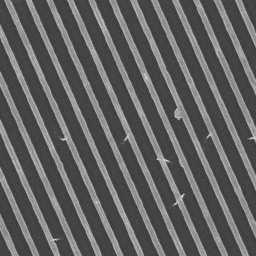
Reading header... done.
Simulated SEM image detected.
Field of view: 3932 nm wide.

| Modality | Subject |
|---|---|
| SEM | parallel lines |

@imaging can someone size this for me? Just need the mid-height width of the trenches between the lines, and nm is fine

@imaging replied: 206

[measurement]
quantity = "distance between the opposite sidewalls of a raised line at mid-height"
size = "82.6 nanometers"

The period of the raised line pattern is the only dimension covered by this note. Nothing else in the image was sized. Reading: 295 nanometers